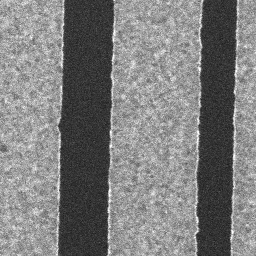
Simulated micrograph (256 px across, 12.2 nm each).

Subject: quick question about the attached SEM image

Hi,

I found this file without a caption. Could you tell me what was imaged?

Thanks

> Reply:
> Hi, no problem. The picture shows one or a few lines or trenches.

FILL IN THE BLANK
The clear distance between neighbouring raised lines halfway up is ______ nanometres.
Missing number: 531